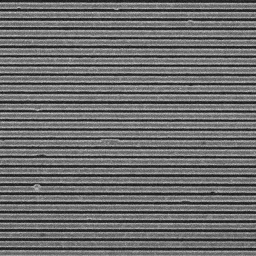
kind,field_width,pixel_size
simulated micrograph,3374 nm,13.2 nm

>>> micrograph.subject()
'parallel lines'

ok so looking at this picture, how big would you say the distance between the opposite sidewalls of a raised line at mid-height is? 0.0725 micrometres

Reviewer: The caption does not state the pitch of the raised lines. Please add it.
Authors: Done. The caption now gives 121 nanometres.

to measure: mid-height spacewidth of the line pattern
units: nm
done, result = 47.8